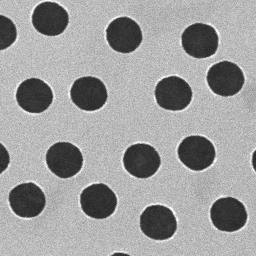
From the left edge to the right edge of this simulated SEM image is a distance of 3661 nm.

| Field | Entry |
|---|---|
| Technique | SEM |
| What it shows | a regular array of holes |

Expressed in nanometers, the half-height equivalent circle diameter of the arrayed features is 526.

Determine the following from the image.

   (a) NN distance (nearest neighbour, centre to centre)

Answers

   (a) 784 nanometers